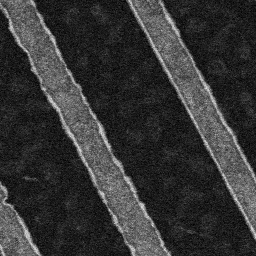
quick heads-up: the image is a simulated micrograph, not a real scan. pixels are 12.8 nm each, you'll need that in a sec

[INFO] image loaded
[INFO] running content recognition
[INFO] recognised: one or a few lines or trenches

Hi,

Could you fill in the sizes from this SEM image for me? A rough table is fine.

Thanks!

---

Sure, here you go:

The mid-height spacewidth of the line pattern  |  86.4 pixels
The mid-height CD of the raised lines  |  343 nm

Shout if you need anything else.